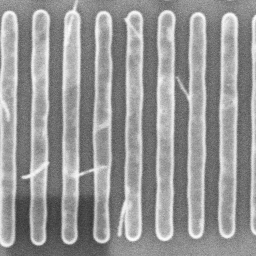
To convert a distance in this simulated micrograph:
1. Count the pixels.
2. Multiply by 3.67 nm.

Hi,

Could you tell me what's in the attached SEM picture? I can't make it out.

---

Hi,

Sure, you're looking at groups of lines, slits or small figures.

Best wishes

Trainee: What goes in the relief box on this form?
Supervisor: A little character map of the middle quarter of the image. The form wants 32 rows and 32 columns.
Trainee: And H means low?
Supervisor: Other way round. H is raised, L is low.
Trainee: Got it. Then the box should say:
HHHHLLLLHHHHLLLLHHHLLLLLHHHLLLLL
HHHHLLLLHHHHLLLLHHHLLLLLHHHLLLLL
HHHHLLLLHHHHLLLLHHHLLLLLHHHLLLLL
HHHHLLLLHHHHLLLLHHHLLLLLHHHLLLLL
HHHHLLLLHHHLLLLLHHHLLLLLHHHLLLLL
HHHHLLLLHHHLLLLLHHHLLLLLHHHLLLLL
HHHHLLLLHHHLLLLLHHHLLLLLHHHLLLLL
HHHHLLLLHHHLLLLLHHHLLLLLHHHLLLLL
HHHHLLLLHHHLLLLLHHHLLLLLHHHLLLLL
HHHLLLLLHHHLLLLLHHHLLLLLHHHLLLLL
HHHLLLLLHHHLLLLLHHHLLLLLHHHLLLLL
HHHLLLLLHHHLLLLLHHHLLLLLHHHLLLLL
HHHLLLLLHHHLLLLLHHHLLLLLHHHLLLLL
HHHLLLLLHHHLLLLLHHHLLLLLHHHLLLLL
HHHLLLLLHHHLLLLLHHHLLLLLHHHLLLLH
HHHLLLLLHHHLLLLLHHHLLLLHHHHLLLLH
HHHLLLLLHHHLLLLLHHHLLLLHHHHLLLLH
HHHLLLLHHHHLLLLLHHHLLLLLHHHLLLLH
HHHLLLLLHHHLLLLLHHHLLLLLHHHLLLLH
HHHLLLLLHHHLLLLLHHHLLLLLHHHLLLLH
HHHLLLLLHHHLLLLLHHHLLLLLHHHLLLLH
HHHLLLLLHHHLLLLLHHHLLLLHHHHLLLLH
HHHLLLLLHHHLLLLLHHHLLLLHHHHLLLLH
HHHLLLLLHHHLLLLLHHHLLLLHHHHLLLLH
HHHLLLLLHHHLLLLLHHHLLLLHHHHLLLLH
HHHLLLLLHHHLLLLLHHHLLLLHHHHLLLLH
HHHLLLLHHHHLLLLLHHHLLLLHHHHLLLLH
HHHHLLLLHHHLLLLLHHHLLLLHHHHLLLLH
HHHLLLLLHHHLLLLLHHHLLLLHHHHLLLLH
HHHLLLLLHHHLLLLLHHHLLLLLHHHLLLLH
HHHLLLLLHHHLLLLLHHHLLLLLHHHLLLLH
HHHLLLLLHHHLLLLLHHHLLLLHHHHLLLLH